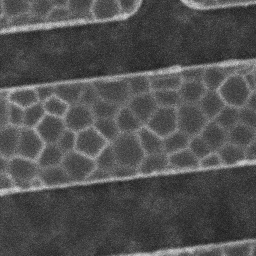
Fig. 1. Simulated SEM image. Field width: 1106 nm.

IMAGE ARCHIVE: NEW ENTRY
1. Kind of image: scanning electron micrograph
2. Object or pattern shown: one or a few lines or trenches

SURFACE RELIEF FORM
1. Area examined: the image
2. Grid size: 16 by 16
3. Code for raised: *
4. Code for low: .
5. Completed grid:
*********.......
*****...........
................
................
.........*******
.***************
****************
****************
****************
****************
*************...
*****...........
................
................
................
............****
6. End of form